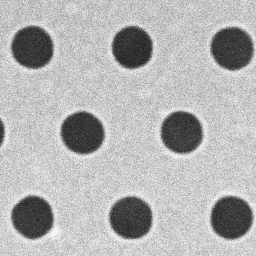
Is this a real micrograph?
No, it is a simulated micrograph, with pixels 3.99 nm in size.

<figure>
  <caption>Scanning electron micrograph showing a regular array of holes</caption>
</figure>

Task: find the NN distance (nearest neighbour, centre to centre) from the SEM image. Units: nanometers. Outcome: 390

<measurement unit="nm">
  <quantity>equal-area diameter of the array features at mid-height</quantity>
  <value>176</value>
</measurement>